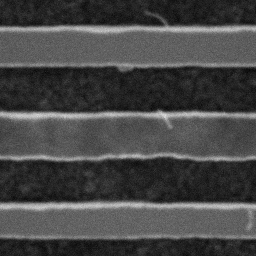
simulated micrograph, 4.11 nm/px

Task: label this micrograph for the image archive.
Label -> lines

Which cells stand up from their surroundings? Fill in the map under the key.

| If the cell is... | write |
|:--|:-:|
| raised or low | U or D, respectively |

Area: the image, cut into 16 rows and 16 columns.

DDDDDDDDDDDDDDDD
DDDDDDDDDDDDDDDD
UUUUUUUUUUUUUUUU
UUUUUUUUUUUUUUUU
DDDDDDDDDDDDDDDD
DDDDDDDDDDDDDDDD
DDDDDDDDDDDDDDDD
UUUUUUUUUUUUUUUU
UUUUUUUUUUUUUUUU
UUUUUUUUUUUUUUUU
DDDDDDDDDDDDDDDD
DDDDDDDDDDDDDDDD
DDDDDDDDDDDDDDDD
UUUUUUUUUUUUUUUU
UUUUUUUUUUUUUUUU
DDDDDDDDDDDDDDDD